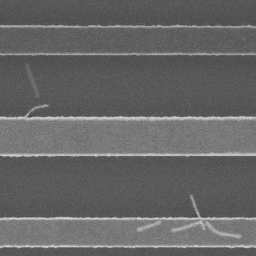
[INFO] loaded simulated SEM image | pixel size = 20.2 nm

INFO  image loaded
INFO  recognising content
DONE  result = lines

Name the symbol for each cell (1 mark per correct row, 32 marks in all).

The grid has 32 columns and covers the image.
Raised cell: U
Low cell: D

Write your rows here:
DDDDDDDDDDDDDDDDDDDDDDDDDDDDDDDD
DDDDDDDDDDDDDDDDDDDDDDDDDDDDDDDD
DDDDDDDDDDDDDDDDDDDDDDDDDDDDDDDD
UUUUUUUUUUUUUUUUUUUUUUUUUUUUUUUU
UUUUUUUUUUUUUUUUUUUUUUUUUUUUUUUU
UUUUUUUUUUUUUUUUUUUUUUUUUUUUUUUU
UUUUUUUUUUUUUUUUUUUUUUUUUUUUUUUU
DDDDDDDDDDDDDDDDDDDDDDDDDDDDDDDD
DDDDDDDDDDDDDDDDDDDDDDDDDDDDDDDD
DDDDDDDDDDDDDDDDDDDDDDDDDDDDDDDD
DDDDDDDDDDDDDDDDDDDDDDDDDDDDDDDD
DDDDDDDDDDDDDDDDDDDDDDDDDDDDDDDD
DDDDDDDDDDDDDDDDDDDDDDDDDDDDDDDD
DDDDDDDDDDDDDDDDDDDDDDDDDDDDDDDD
DDDDDDDDDDDDDDDDDDDDDDDDDDDDDDDD
UUUUUUUUUUUUUUUUUUUUUUUUUUUUUUUU
UUUUUUUUUUUUUUUUUUUUUUUUUUUUUUUU
UUUUUUUUUUUUUUUUUUUUUUUUUUUUUUUU
UUUUUUUUUUUUUUUUUUUUUUUUUUUUUUUU
UUUUDDUDDUDUDUDDDDDDDDDDDDDDDDDD
DDDDDDDDDDDDDDDDDDDDDDDDDDDDDDDD
DDDDDDDDDDDDDDDDDDDDDDDDDDDDDDDD
DDDDDDDDDDDDDDDDDDDDDDDDDDDDDDDD
DDDDDDDDDDDDDDDDDDDDDDDDDDDDDDDD
DDDDDDDDDDDDDDDDDDDDDDDDDDDDDDDD
DDDDDDDDDDDDDDDDDDDDDDDDDDDDDDDD
DDDDDDDDDDDDDDDDDDDDDDDDDDDDDDDD
UUUUUUUUUUUUUUUUUUUUUUUUUUUUUUUU
UUUUUUUUUUUUUUUUUUUUUUUUUUUUUUUU
UUUUUUUUUUUUUUUUUUUUUUUUUUUUUUUU
UUUUUUUUUUUUUUUUUUUUUUUUUUUUUUUU
DDDDDDDDDDDDDDDDDDDDDDDDDDDDDDDD